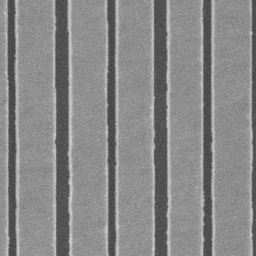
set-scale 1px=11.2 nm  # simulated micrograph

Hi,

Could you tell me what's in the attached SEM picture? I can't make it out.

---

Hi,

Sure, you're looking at lines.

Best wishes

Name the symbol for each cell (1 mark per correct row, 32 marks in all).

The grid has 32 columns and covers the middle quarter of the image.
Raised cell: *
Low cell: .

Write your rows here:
..*********..*********....******
..*********..*********....******
..*********..*********....******
..*********..*********....******
..*********..*********....******
..*********..*********....******
..*********..*********....******
..*********..*********....******
..*********..*********....******
..*********..*********....******
..*********..*********....******
..*********..*********....******
..*********..*********....******
..*********..*********....******
..*********..*********....******
..*********..*********....******
..*********..*********....******
..*********..*********....******
..*********..*********....******
..*********..*********....******
..*********..*********....******
.**********..*********....******
.**********..*********....******
..*********..*********....******
..*********..*********....******
..*********..*********....******
..*********..*********....******
..*********..**********...******
..*********..**********...******
..*********..**********...******
..*********..**********...******
..*********..**********...******